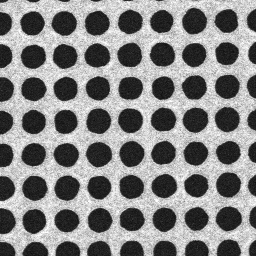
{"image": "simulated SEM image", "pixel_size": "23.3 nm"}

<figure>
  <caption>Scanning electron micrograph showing a regular array of holes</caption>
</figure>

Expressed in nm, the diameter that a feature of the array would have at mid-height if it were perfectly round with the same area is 572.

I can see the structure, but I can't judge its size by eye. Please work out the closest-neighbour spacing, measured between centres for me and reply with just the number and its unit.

747 nanometers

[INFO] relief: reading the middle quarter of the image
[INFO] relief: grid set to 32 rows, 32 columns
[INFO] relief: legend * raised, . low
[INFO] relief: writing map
..*****...*****...*****...*****.
********************************
********************************
..*****...*****...******..*****.
...***.....***.....***.....***..
...**.......**......**......*...
...***......*.......**......*...
...***.....***.....***.....***..
..*****...****....*****...*****.
********************************
********************************
.******...*****...*****....****.
...***.....***.....***......**..
...***......**......**......**..
....*.......*.......**......**..
...***......**.....***......**..
...***.....****....****....****.
.*******************************
********************************
****************..******..******
...***.....***.....****....****.
...***......**......**......**..
....*.......**......**......**..
....**......**......**......**..
...***.....****....****....****.
..*****...*****...**************
********************************
*************************.******
...****....***.....****....****.
....**.....***......**......**..
....**......**......**......**..
....**......**......**......**..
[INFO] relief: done